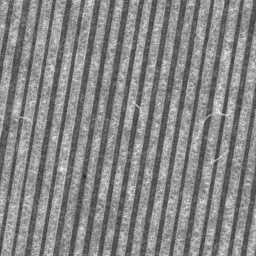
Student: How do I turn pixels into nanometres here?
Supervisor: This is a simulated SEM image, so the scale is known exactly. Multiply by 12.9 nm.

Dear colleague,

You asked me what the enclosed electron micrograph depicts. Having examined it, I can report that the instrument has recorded parallel lines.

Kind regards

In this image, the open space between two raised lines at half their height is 78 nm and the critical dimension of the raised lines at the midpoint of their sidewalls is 103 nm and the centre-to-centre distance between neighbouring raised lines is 183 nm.